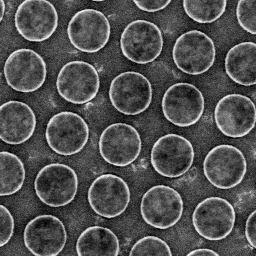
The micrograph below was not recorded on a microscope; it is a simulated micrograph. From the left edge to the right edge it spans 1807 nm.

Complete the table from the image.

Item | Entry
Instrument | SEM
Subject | a regular array of raised bodies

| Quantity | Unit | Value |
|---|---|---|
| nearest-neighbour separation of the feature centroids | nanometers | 371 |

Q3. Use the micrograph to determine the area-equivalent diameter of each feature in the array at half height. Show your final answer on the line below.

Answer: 291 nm